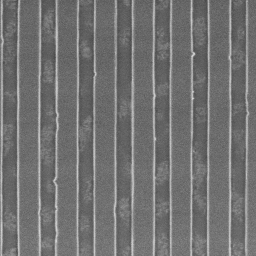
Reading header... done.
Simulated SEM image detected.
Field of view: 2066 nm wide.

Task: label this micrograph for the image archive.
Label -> parallel lines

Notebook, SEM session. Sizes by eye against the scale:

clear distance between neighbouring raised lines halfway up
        129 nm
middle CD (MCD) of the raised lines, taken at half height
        21.7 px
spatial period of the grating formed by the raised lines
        0.307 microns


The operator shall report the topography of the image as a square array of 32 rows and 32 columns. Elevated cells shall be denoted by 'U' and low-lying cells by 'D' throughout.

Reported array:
DDUUUDDUUUDDUUUDDUUDDUUUDDUUUDDU
DDUUUDDUUUDDUUUDDUUDDUUUDDUUUDDU
DDUUUDDUUUDDUUUDDUUDDUUUDDUUUDDU
DDUUUDDUUUDDUUUDDUUDDUUUDDUUUDDU
DDUUUDDUUUDDUUUDDUUDDUUUDDUUUDDU
DDUUUDDUUUDDUUUDDUUDDUUUDDUUUDDU
DDUUUDDUUUDDUUUDDUUDDUUUDDUUUDDU
DDUUUDDUUUDDUUUDDUUDDUUUDDUUUDDU
DDUUUDDUUUDDUUUDDUUDDUUUDDUUUDDU
DDUUUDDUUUDDUUDDDUUDDUUUDDUUUDDU
DDUUUDDUUUDDUUDDDUUDDUUUDDUUUDDU
DDUUUDDUUUDDUUDDDUUDDUUUDDUUUDDU
DDUUUDDUUUDDUUUDDUUDDUUUDDUUUDDU
DDUUUDDUUUDDUUDDDUUDDUUUDDUUUDDU
DDUUUDDUUUDDUUDDDUUDDUUUDDUUUDDU
DDUUUDDUUUDDUUDDDUUDDUUUDDUUUDDU
DDUUUDDUUUDDUUDDDUUDDUUUDDUUUDDU
DDUUUDDUUUDDUUDDDUUDDUUUDDUUUDDU
DDUUUDDUUUDDUUDDDUUDDUUUDDUUUDDU
DDUUUDDUUUDDUUDDDUUDDUUUDDUUUDDU
DDUUUDDUUUDDUUDDDUUDDUUUDDUUUDDU
DDUUUDDUUUDDUUDDDUUDDUUUDDUUUDDU
DDUUUDDUUUDDUUDDDUUDDUUUDDUUUDDU
DDUUUDDUUUDDUUDDDUUDDUUUDDUUUDDU
DDUUUDDUUUDDUUUDDUUDDUUUDDUUUDDU
DDUUUDDUUUDDUUDDDUUDDUUUDDUUUDDU
DDUUUDDUUUDDUUDDDUUDDUUUDDUUUDDU
DDUUUDDUUUDDUUDDDUUDDUUUDDUUUDDU
DDUUUDDUUUDDUUDDDUUDDUUUDDUUUDDU
DDUUUDDUUUDDUUDDDUUDDUUUDDUUUDDU
DDUUUDDUUUDDUUDDDUUDDUUUDDUUUDDU
DDUUUDDUUUDDUUDDDUUDDUUUDDUUUDDU